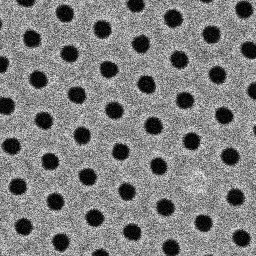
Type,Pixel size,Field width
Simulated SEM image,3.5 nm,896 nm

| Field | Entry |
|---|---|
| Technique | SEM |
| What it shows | a regular array of holes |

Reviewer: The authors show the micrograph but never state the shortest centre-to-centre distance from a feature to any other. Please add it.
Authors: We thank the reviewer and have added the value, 40.6 pixels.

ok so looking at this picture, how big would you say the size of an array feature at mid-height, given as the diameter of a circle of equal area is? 61.1 nm